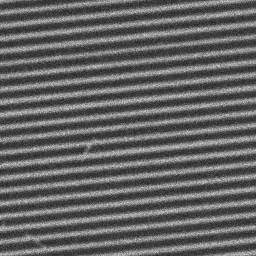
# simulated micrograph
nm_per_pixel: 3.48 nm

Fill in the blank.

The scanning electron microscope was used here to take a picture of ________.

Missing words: parallel lines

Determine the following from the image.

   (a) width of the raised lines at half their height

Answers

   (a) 15.1 nanometers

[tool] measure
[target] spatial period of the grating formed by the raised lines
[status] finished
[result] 44.1 nm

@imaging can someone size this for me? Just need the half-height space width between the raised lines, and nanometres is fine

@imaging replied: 27.7